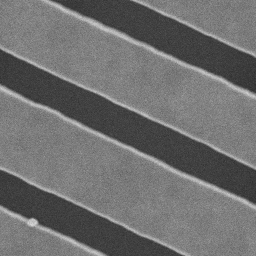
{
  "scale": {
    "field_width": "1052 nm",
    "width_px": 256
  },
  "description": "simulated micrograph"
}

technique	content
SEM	lines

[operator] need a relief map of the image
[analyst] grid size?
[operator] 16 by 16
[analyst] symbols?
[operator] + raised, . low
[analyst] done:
++++.....+++++++
++++++.....+++++
+++++++++.....++
.++++++++++.....
...++++++++++...
.....++++++++++.
++.....+++++++++
+++++.....++++++
+++++++.....++++
+++++++++.....++
+++++++++++.....
..+++++++++++...
....+++++++++++.
+.....++++++++++
++++....++++++++
++++++.....+++++